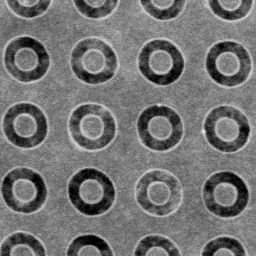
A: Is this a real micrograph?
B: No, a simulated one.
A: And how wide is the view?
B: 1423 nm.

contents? a regular array of ring-shaped grooves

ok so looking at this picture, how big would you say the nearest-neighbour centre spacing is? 362 nm